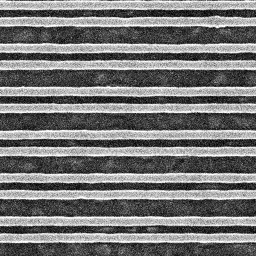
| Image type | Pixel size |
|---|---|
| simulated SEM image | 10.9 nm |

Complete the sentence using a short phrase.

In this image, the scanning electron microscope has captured parallel lines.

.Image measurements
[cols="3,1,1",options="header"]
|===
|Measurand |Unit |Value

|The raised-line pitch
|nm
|231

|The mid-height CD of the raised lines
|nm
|92.9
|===